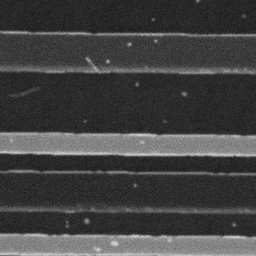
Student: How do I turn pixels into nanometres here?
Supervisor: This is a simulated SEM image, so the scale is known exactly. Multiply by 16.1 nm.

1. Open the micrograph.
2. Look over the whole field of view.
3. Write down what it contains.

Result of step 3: lines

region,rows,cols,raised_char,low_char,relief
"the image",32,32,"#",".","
................................
................................
................................
................................
################################
################################
################################
################################
...#############################
................................
................................
................................
................................
................................
................................
................................
................................
################################
################################
................................
................................
#####.......#...................
################################
################################
################################
################################
................................
................................
................................
######.##.......................
################################
################################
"